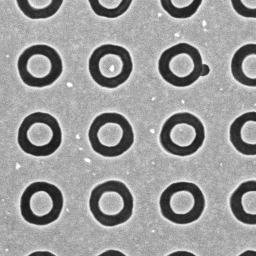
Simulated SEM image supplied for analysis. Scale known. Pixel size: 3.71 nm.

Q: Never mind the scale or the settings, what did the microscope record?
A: a regular array of ring-shaped grooves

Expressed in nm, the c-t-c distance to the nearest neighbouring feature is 256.